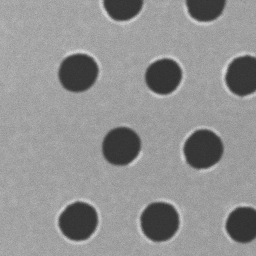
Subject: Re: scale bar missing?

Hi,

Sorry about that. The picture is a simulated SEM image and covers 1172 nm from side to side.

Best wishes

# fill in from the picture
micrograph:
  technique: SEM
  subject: holes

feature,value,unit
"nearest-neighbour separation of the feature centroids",0.374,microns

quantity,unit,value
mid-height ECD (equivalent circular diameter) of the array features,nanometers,178